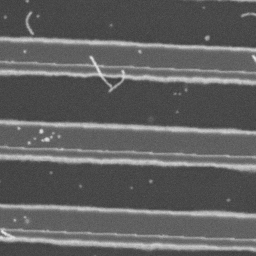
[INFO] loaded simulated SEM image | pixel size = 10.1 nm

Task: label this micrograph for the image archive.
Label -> lines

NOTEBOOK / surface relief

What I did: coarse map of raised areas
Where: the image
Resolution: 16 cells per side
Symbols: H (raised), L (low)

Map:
LLLLLLLLLLLLLLLL
LLLLLLLLLLLLLLLL
LLLLLLLLLLLLLLLL
HHHHHHHHHHHHHHHH
LLHHHHHHHHHHHHHH
LLLLLLLLLLLLLLLL
LLLLLLLLLLLLLLLL
LLLLLLLLLLLLLLLL
HHHHHHHHHHHHHHHH
HHHHHHHHHHHHHHHH
LLLLLLLLLLLLLLLL
LLLLLLLLLLLLLLLL
LLLLLLLLLLLLLLLL
HHHHHHHHHHHHHHLL
HHHHHHHHHHHHHHHH
LLLLLLLLLLLLLLHH